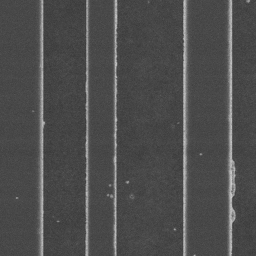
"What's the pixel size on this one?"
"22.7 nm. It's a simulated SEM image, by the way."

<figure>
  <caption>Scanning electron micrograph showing lines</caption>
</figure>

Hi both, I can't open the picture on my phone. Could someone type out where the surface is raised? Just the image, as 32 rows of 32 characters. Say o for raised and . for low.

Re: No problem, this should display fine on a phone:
ooooo......ooo.........oooooo...
ooooo......ooo.........oooooo...
ooooo......ooo.........oooooo...
ooooo......ooo.........oooooo...
ooooo......ooo.........oooooo...
ooooo......ooo.........oooooo...
ooooo......ooo.........oooooo...
ooooo......ooo.........oooooo...
ooooo......ooo.........oooooo...
ooooo......ooo.........oooooo...
ooooo......ooo.........oooooo...
ooooo......ooo.........oooooo...
ooooo......ooo.........oooooo...
ooooo......ooo.........oooooo...
ooooo......ooo.........oooooo...
ooooo......ooo.........oooooo...
ooooo......ooo.........oooooo...
ooooo......ooo.........oooooo...
ooooo......ooo.........oooooo...
ooooo......ooo.........oooooo...
ooooo......ooo.........oooooo...
ooooo......ooo.........oooooo...
ooooo......ooo.........oooooo...
ooooo......ooo.........oooooo...
ooooo......ooo.........oooooo...
ooooo......ooo.........oooooo...
ooooo......ooo.........oooooo...
ooooo......ooo.........oooooo...
ooooo......ooo.........oooooo...
ooooo......ooo.........oooooo...
ooooo......ooo.........oooooo...
ooooo......ooo.........oooooo...